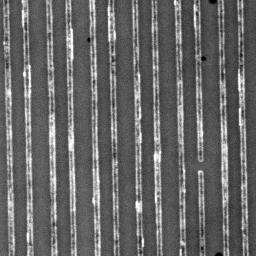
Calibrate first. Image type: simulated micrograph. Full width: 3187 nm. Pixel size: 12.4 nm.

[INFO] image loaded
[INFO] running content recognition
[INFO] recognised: parallel lines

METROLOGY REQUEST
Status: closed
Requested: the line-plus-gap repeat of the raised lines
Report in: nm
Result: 264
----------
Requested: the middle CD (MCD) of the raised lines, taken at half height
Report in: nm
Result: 52.9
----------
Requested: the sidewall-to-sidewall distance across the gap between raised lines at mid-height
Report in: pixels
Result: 16